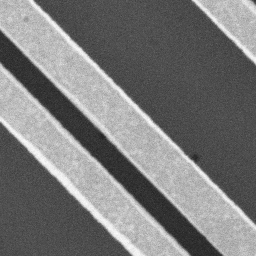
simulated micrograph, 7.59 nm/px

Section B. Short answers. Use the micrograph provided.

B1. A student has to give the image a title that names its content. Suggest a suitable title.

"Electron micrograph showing lines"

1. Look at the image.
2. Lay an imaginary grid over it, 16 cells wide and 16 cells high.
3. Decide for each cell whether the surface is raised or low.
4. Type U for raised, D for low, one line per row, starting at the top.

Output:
UUDDDDDDDDDDDUUU
UUUDDDDDDDDDDDUU
DUUUDDDDDDDDDDDU
DDUUUDDDDDDDDDDD
DDDUUUDDDDDDDDDD
UDDDUUUDDDDDDDDD
UUDDDUUUDDDDDDDD
UUUDDDUUUDDDDDDD
DUUUDDDUUUDDDDDD
DDUUUDDDUUUDDDDD
DDDUUUDDDUUUDDDD
DDDDUUUDDDUUUDDD
DDDDDUUUDDDUUUDD
DDDDDDUUUDDDUUUD
DDDDDDDUUUDDDUUU
DDDDDDDDUUUDDDUU